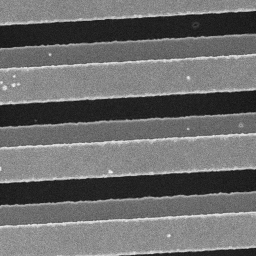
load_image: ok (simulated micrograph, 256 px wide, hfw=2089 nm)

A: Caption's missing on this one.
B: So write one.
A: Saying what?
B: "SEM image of lines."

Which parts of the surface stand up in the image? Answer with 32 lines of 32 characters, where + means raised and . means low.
++++++++++++++++++++++++++++++++
++++++++++++++++++++++++++++++..
++++++++++++....................
................................
............................++++
.........+++++++++++++++++++++++
++++++++++++++++++++++++++++++++
++++++++++++++++++++++++++++++++
++++++++++++++++++++++++++++++++
++++++++++++++++++++++++++++++++
++++++++++++++++++++++++++++++++
+++++++++++++++++++++++++++.....
++++++++++......................
................................
.........................+++++++
.......+++++++++++++++++++++++++
++++++++++++++++++++++++++++++++
++++++++++++++++++++++++++++++++
++++++++++++++++++++++++++++++++
++++++++++++++++++++++++++++++++
++++++++++++++++++++++++++++++++
++++++++++++++++++++++++........
+++++++.........................
................................
......................++++++++++
....++++++++++++++++++++++++++++
++++++++++++++++++++++++++++++++
++++++++++++++++++++++++++++++++
++++++++++++++++++++++++++++++++
++++++++++++++++++++++++++++++++
++++++++++++++++++++++++++++++++
++++++++++++++++++++++..........